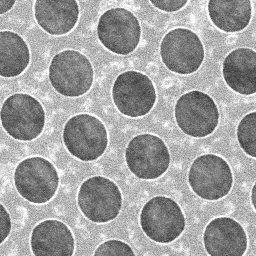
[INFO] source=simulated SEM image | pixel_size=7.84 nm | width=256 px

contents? a regular array of holes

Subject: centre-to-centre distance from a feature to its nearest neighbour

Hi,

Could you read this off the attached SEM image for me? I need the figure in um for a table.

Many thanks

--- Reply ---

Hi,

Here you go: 0.502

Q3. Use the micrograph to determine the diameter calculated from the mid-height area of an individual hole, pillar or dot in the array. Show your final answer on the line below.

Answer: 361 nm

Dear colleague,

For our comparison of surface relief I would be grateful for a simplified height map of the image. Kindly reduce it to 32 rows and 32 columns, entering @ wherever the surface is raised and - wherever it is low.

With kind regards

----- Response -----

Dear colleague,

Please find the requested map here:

--@@------@@@@@@@@@----@@@-----@
-@@@------@@@---@@@@@-@@@@------
@@@@------@@-----@@@@@@@@@-----@
@@@@@----@@@------@@@@-@@@@----@
--@@@@@@@@@@------@@@----@@@@@@@
---@@@@@@@@@@----@@@-----@@@@@@@
----@@@---@@@@--@@@@------@@@---
----@@-----@@@@@@@@@-----@@@----
---@@@------@@@@@@@@@----@@@----
--@@@@------@@@---@@@@@@@@@@----
@@@@@@------@@-----@@@@@@@@@----
@@@@@@@----@@@------@@@@-@@@@---
@----@@@@@@@@@------@@-----@@@@@
-----@@@@@@@@@@----@@@-----@@@@@
------@@@---@@@@--@@@@-----@@@@-
------@@-----@@@@@@@@@-----@@@--
@----@@@-----@@@@@@@@@@----@@@--
@@--@@@@------@@----@@@@@@@@@@--
@@@@@@@@-----@@@-----@@@@@@@@@--
@@@@@@@@@----@@@-----@@@@--@@@@-
@@-----@@@@@@@@@-----@@@-----@@@
@@-----@@@@@@@@@-----@@@-----@@@
@@-----@@@@---@@@@@@@@@@-----@@@
@@-----@@@-----@@@@@@@@@-----@@@
@@@----@@@-----@@@@@-@@@@---@@@-
@@@@@@@@@@-----@@@----@@@@@@@@@-
-@@@@@@@@@-----@@@-----@@@@@@@@@
-@@@@@-@@@@---@@@------@@@---@@@
-@@@-----@@@@@@@@@-----@@@----@@
-@@@-----@@@@@@@@@----@@@------@
@@@@-----@@@@---@@@@@@@@@------@
@@@@-----@@@-----@@@@@@@@@-----@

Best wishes